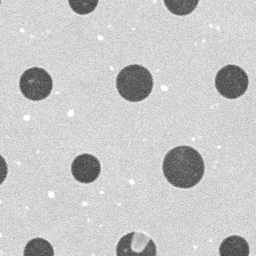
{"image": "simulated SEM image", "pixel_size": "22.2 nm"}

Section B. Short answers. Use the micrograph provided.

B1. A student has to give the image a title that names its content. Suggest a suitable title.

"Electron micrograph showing holes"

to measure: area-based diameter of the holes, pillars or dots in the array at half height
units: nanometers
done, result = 777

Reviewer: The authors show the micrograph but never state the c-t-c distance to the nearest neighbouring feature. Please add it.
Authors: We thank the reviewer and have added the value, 97.1 px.